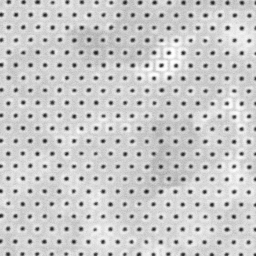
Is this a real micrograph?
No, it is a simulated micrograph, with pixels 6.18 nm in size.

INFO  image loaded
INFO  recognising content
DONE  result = a regular array of holes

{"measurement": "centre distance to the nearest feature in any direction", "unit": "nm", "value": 87.4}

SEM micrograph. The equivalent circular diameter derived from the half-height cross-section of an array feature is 30.4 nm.